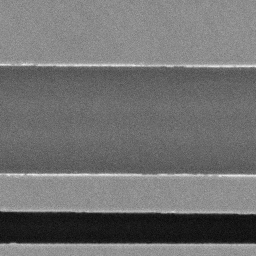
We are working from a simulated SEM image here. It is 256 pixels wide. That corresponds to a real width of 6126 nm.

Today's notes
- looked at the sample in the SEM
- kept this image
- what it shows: lines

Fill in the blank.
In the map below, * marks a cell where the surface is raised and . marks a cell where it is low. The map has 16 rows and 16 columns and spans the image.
****************
****************
****************
****************
................
................
................
................
................
................
................
****************
****************
................
................
****************